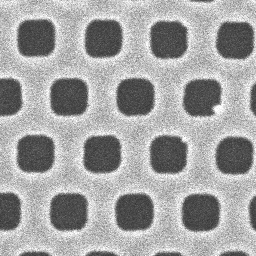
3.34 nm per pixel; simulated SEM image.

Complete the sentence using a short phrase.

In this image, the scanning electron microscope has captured a regular array of holes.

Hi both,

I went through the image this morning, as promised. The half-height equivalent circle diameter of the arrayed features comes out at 0.138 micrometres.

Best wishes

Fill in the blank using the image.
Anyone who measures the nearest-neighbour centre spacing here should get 220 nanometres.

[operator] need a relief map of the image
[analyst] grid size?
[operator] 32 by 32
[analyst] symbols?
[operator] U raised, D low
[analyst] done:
UUUUUUUUUUUUUUUUUUUUUUUUUUUUUUUU
UUUUUUUUUUUUUUUUUUUUUUUUUUUUUUUU
UUUDDDUUUUUUDDUUUUUUUUUUUUUUUUUU
UUDDDDDUUUUDDDDUUUUDDDDUUUUDDDDD
UUDDDDDUUUUDDDDUUUUDDDDUUUUDDDDD
UUDDDDDUUUUDDDDUUUUDDDDDUUUDDDDD
UUDDDDDUUUUDDDDUUUUDDDDUUUUDDDDD
UUUUUUUUUUUUUUUUUUUUUUUUUUUUUUUU
UUUUUUUUUUUUUUUUUUUUUUUUUUUUUUUU
UUUUUUUUUUUUUUUUUUUUUUUUUUUUUUUU
DDDUUUUDDDDUUUUDDDDUUUUDDDDDUUUU
DDDUUUDDDDDUUUUDDDDUUUUDDDDDUUUD
DDDUUUDDDDDUUUUDDDDUUUUDDDDDUUUD
DDDUUUDDDDDUUUUDDDDUUUUDDDDUUUUD
DUUUUUUUDDUUUUUUDDUUUUUUDDUUUUUU
UUUUUUUUUUUUUUUUUUUUUUUUUUUUUUUU
UUUUUUUUUUUUUUUUUUUUUUUUUUUUUUUU
UUDDDDDUUUUDDDDUUUUDDDDUUUUUDDDU
UUDDDDDUUUDDDDDUUUUDDDDDUUUDDDDD
UUDDDDDUUUDDDDDUUUUDDDDUUUUDDDDD
UUDDDDDUUUDDDDDUUUUDDDDUUUUDDDDD
UUUDDDUUUUUDDDUUUUUDDDDUUUUUDDDU
UUUUUUUUUUUUUUUUUUUUUUUUUUUUUUUU
UUUUUUUUUUUUUUUUUUUUUUUUUUUUUUUU
DDUUUUUDDDDUUUUDDDDUUUUDDDDUUUUU
DDDUUUDDDDDUUUDDDDDUUUUDDDDUUUUD
DDDUUUDDDDDUUUDDDDDUUUUDDDDDUUUD
DDDUUUDDDDDUUUDDDDDUUUUDDDDUUUUD
DDUUUUUDDDUUUUUDDDDUUUUDDDDUUUUU
UUUUUUUUUUUUUUUUUUUUUUUUUUUUUUUU
UUUUUUUUUUUUUUUUUUUUUUUUUUUUUUUU
UUUDDDUUUUUDDDUUUUUUDDUUUUUUDDDU